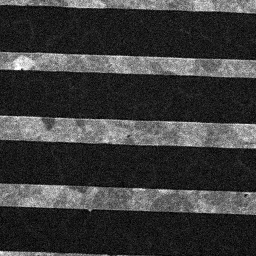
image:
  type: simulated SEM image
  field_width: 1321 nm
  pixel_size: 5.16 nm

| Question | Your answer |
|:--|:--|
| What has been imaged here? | one or a few lines or trenches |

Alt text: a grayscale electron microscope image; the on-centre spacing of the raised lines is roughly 346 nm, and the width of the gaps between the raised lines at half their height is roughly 240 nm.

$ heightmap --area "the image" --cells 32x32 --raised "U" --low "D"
UUUUUUUUUUUUUUUUUUUUUUUUUUUUUUUU
DDDDDDDDDDDDDDDDDDDDDDDDDDDDDDUU
DDDDDDDDDDDDDDDDDDDDDDDDDDDDDDDD
DDDDDDDDDDDDDDDDDDDDDDDDDDDDDDDD
DDDDDDDDDDDDDDDDDDDDDDDDDDDDDDDD
UUDDDDDDDDDDDDDDDDDDDDDDDDDDDDDD
UUDDDDDDDDDDDDDDDDDDDDDDDDDDDDDD
UUUUUUUUUUUUUUUUUUUUUUUUUUUUUDDD
UUUUUUUUUUUUUUUUUUUUUUUUUUUUUUUU
DDDDDDDDDDDDDDDDDDDDDDDDDDDUUUUU
DDDDDDDDDDDDDDDDDDDDDDDDDDDDDDDD
DDDDDDDDDDDDDDDDDDDDDDDDDDDDDDDD
DDDDDDDDDDDDDDDDDDDDDDDDDDDDDDDD
DDDDDDDDDDDDDDDDDDDDDDDDDDDDDDDD
DDDDDDDDDDDDDDDDDDDDDDDDDDDDDDDD
UUUUUUUUUUUUUUUUUUUUUUUUUUUDDDDD
UUUUUUUUUUUUUUUUUUUUUUUUUUUUUUUU
DDUUUUUUUUUUUUUUUUUUUUUUUUUUUUUU
DDDDDDDDDDDDDDDDDDDDDDDDDDDDDDDD
DDDDDDDDDDDDDDDDDDDDDDDDDDDDDDDD
DDDDDDDDDDDDDDDDDDDDDDDDDDDDDDDD
DDDDDDDDDDDDDDDDDDDDDDDDDDDDDDDD
DDDDDDDDDDDDDDDDDDDDDDDDDDDDDDDD
UUUUUUUUUUUUUUDDDDDDDDDDDDDDDDDD
UUUUUUUUUUUUUUUUUUUUUUUUUUUUUUUU
UUUUUUUUUUUUUUUUUUUUUUUUUUUUUUUU
DDDDDDDDDDDDDDDDDDDDDDDDUUUUUUUU
DDDDDDDDDDDDDDDDDDDDDDDDDDDDDDDD
DDDDDDDDDDDDDDDDDDDDDDDDDDDDDDDD
DDDDDDDDDDDDDDDDDDDDDDDDDDDDDDDD
DDDDDDDDDDDDDDDDDDDDDDDDDDDDDDDD
UDDDDDDDDDDDDDDDDDDDDDDDDDDDDDDD